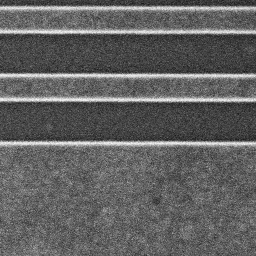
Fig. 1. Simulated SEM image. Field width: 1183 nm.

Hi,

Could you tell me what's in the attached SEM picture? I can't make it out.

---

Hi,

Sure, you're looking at one or a few lines or trenches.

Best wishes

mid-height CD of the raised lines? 0.119 micrometres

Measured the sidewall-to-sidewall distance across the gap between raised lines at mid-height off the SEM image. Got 194 nm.